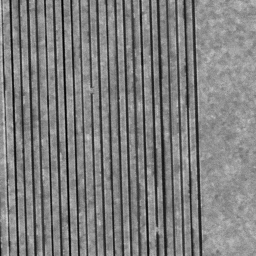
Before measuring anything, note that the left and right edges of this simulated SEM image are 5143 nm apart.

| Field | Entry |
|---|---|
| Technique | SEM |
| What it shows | parallel lines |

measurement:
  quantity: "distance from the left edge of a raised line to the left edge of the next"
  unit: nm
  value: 175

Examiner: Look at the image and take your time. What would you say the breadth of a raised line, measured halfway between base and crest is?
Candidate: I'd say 120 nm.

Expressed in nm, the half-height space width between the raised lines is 60.3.